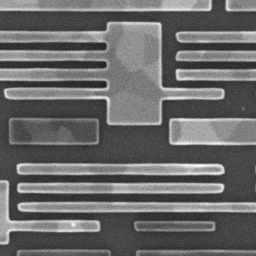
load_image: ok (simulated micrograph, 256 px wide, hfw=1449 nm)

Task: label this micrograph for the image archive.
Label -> wiring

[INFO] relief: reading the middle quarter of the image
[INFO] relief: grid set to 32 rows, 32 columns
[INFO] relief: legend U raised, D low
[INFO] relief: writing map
DDDDDDDDDDDUUUUUUUUUUUUUDDDDDDDD
UUUUUUUUUUUUUUUUUUUUUUUUDDDDUUUU
UUUUUUUUUUUUUUUUUUUUUUUUDDDDUUUU
UUUUUUUUUUUUUUUUUUUUUUUUDDDDUUUU
DDDDDDDDDDDUUUUUUUUUUUUUDDDDDDDD
DDDDDDDDDDDUUUUUUUUUUUUUUDDDDDDD
UUUUUUUUUUUUUUUUUUUUUUUUUUUUUUUU
UUUUUUUUUUUUUUUUUUUUUUUUUUUUUUUU
UUUUUUUUUUUUUUUUUUUUUUUUUUUUUUUU
DDDDDDDDDDDUUUUUUUUUUUUUDDDDDDDD
DDDDDDDDDDDUUUUUUUUUUUUUDDDDDDDD
DDDDDDDDDDDUUUUUUUUUUUUUDDDDDDDD
DDDDDDDDDDDUUUUUUUUUUUUUDDDDDDDD
DDDDDDDDDDDUUUUUUUUUUUUUDDDDDDDD
UUUUUUUUUDDUUUUUUUUUUUUUDDDUUUUU
UUUUUUUUUDDDDDDDDDDDDDDDDDDUUUUU
UUUUUUUUUDDDDDDDDDDDDDDDDDDUUUUU
UUUUUUUUUDDDDDDDDDDDDDDDDDDUUUUU
UUUUUUUUUDDDDDDDDDDDDDDDDDDUUUUU
UUUUUUUUUDDDDDDDDDDDDDDDDDDUUUUU
DDDDDDDDDDDDDDDDDDDDDDDDDDDDDDDD
DDDDDDDDDDDDDDDDDDDDDDDDDDDDDDDD
DDDDDDDDDDDDDDDDDDDDDDDDDDDDDDDD
DDDDDDDDDDDDDDDDDDDDDDDDDDDDDDDD
DDDDDDDDDDDDDDDDDDDDDDDDDDDDDDDD
UUUUUUUUUUUUUUUUUUUUUUUUUUUUUUUU
UUUUUUUUUUUUUUUUUUUUUUUUUUUUUUUU
UUUUUUUUUUUUUDDDDUUUUUUUUUUUUUUU
DDDDDDDDDDDDDDDDDDDDDDDDDDDDDDDD
DDDDDDDDDDDDDDDDDDDDDDDDDDDDDDDD
UUUUUUUUUUUUUUUUUUUUUUUUUUUUUUUU
UUUUUUUUUUUUUUUUUUUUUUUUUUUUUUUU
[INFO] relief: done